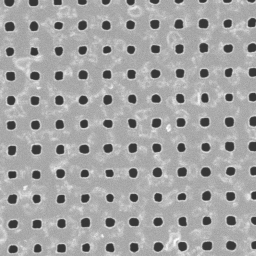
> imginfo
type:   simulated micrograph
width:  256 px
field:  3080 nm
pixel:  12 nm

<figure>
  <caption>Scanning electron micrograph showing a regular array of holes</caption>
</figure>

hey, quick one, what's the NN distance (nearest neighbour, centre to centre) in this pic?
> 287 nm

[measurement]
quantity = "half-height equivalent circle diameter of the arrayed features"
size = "112 nm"